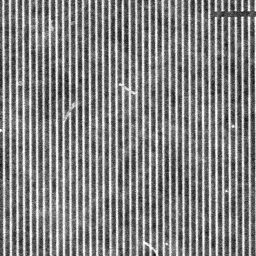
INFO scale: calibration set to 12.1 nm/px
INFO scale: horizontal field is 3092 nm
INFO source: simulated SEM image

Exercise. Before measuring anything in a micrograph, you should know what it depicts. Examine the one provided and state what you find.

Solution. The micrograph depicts parallel lines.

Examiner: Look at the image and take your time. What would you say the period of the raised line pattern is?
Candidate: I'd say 80.2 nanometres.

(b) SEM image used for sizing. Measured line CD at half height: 12.1 nm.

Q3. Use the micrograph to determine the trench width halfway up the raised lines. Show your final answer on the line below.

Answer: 0.0695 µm